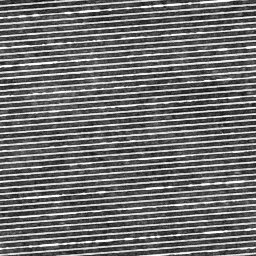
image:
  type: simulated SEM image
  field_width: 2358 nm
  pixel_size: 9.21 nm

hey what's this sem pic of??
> parallel lines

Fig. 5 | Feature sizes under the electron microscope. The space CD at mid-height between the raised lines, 44.7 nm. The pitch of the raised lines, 55.7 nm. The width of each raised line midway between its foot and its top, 0.0138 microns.